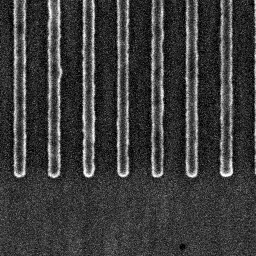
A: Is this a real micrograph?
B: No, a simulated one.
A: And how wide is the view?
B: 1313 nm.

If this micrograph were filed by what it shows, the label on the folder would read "parallel lines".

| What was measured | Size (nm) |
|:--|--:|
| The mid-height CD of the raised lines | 50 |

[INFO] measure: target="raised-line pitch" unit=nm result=176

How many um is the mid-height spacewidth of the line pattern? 0.127